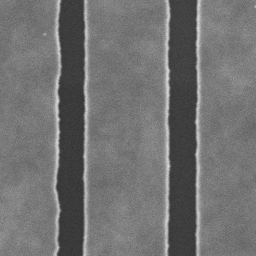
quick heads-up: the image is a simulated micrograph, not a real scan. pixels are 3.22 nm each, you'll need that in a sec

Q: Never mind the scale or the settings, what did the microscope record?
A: lines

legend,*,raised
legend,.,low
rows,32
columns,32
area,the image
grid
********...**********....*******
*******....**********....*******
*******....**********....*******
*******....**********....*******
*******....**********....*******
*******....**********....*******
********...**********....*******
********...**********....*******
********...**********....*******
********...**********....*******
*******....**********....*******
*******....**********....*******
*******....**********....*******
*******....**********....*******
*******....**********....*******
*******....**********...********
*******....**********....*******
*******....**********....*******
*******....**********....*******
*******....**********....*******
*******....**********....*******
*******....**********....*******
*******...***********....*******
*******....**********....*******
*******....**********....*******
*******....**********....*******
*******....**********....*******
*******....**********....*******
*******....**********....*******
*******....**********....*******
*******...***********....*******
*******...***********....*******